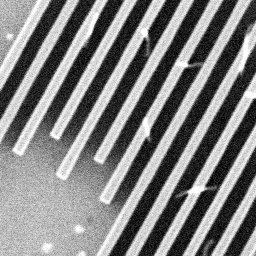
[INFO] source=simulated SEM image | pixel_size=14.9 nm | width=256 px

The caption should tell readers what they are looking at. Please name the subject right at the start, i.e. groups of lines, slits or small figures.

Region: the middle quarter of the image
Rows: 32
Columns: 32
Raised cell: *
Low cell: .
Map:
**....***....***.....**.....***.
*.....**.....**.....***....***..
*....***....***....***....***...
....***....***.....**.....***...
....***....***....***....***....
...***....***.....**.....**.....
...**.....***....***....***.....
..***.....**.....**.....**.....*
..**.....**.....***....***....**
.***....***....***.....**.....**
.**.....**.....***....***....***
***....***....***....***.....**.
**.....**.....**.....***....***.
**....***....***....***.....**..
*.....**.....**.....**.....***..
.....***....***....***....***...
....***....***.....**.....**....
....**.....***....***....***....
...***....***.....**.....**.....
...**.....**.....***....***....*
..***....***.....**.....**.....*
..**.....**.....**.....***....**
.***....***....***.....**.....**
.**.....**.....***....***....***
***...........***....***.....**.
**............**.....***....***.
**...........***....***....***..
*............**.....***....**...
............***....***....***...
...........***.....**.....**....
...........***....***....***....
..........***.....**.....**....*